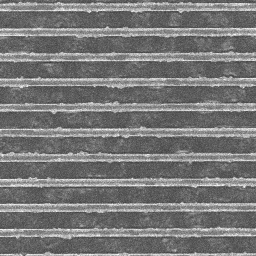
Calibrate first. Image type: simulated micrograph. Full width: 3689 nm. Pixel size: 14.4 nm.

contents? parallel lines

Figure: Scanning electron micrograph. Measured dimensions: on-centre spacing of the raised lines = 362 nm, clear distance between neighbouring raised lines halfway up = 17.9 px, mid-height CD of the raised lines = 110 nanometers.